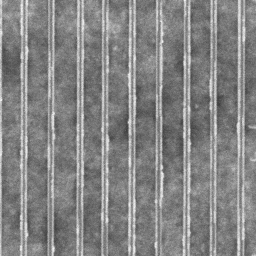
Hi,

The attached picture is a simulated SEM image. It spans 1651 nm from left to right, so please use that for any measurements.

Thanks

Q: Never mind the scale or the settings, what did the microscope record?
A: parallel lines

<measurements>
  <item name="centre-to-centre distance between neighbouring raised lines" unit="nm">175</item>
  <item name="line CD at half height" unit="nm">34.7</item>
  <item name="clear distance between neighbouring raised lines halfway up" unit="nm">136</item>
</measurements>